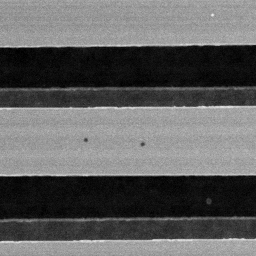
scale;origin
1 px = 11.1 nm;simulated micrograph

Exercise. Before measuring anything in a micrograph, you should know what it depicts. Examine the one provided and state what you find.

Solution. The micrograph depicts lines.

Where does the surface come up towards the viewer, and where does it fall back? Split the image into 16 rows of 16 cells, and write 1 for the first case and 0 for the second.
1111111111111111
1111111111111111
1111111111111111
0000000000000000
0000000000000000
0000000000000000
1111111111111111
1111111111111111
1111111111111111
1111111111111111
1111111111111111
0000000000000000
0000000000000000
0000000000000000
1111111111111111
1111111111111111